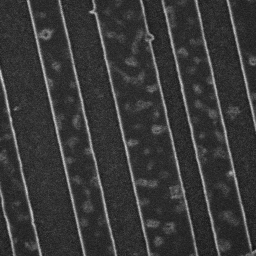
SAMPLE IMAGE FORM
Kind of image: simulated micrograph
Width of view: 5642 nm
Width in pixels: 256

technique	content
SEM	one or a few lines or trenches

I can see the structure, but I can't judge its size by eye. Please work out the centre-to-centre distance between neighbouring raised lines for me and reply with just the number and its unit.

66.6 px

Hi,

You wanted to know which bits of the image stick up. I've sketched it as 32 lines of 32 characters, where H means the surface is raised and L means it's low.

LLLLHHHHLLLLHHHHHHLLHHHHHLLLLHHH
LLLLHHHHLLLLHHHHHHLLLHHHHLLLLHHH
LLLLHHHHLLLLHHHHHHLLLHHHHLLLLHHH
LLLLHHHHLLLLHHHHHHLLLHHHHLLLLHHH
LLLLLHHHLLLLLHHHHHHLLHHHHHLLLHHH
LLLLLHHHHLLLLHHHHHHLLLHHHHLLLLHH
LLLLLHHHHLLLLHHHHHHLLLHHHHLLLLHH
LLLLLHHHHLLLLHHHHHHLLLHHHHLLLLHH
LLLLLHHHHLLLLHHHHHHHLLHHHHLLLLHH
LLLLLLHHHHLLLLHHHHHHLLHHHHHLLLLH
LLLLLLHHHHLLLLHHHHHHLLLHHHHLLLLH
HLLLLLHHHHLLLLHHHHHHLLLHHHHLLLLH
HLLLLLHHHHLLLLHHHHHHLLLHHHHLLLLH
HLLLLLHHHHLLLLLHHHHHHLLHHHHLLLLH
HLLLLLLHHHHLLLLHHHHHHLLLHHHHLLLL
HLLLLLLHHHHLLLLHHHHHHLLLHHHHLLLL
HHLLLLLHHHHLLLLHHHHHHLLLHHHHLLLL
HHLLLLLHHHHLLLLHHHHHHHLLHHHHLLLL
HHLLLLLLHHHLLLLLHHHHHHLLHHHHHLLL
HHLLLLLLHHHHLLLLHHHHHHLLLHHHHLLL
HHHLLLLLHHHHLLLLHHHHHHLLLHHHHLLL
HHHLLLLLHHHHLLLLHHHHHHLLLHHHHLLL
HHHLLLLLHHHHLLLLLHHHHHHLLHHHHLLL
HHHLLLLLLHHHHLLLLHHHHHHLLLHHHHLL
HHHLLLLLLHHHHLLLLHHHHHHLLLHHHHLL
HHHHLLLLLHHHHLLLLHHHHHHLLLHHHHLL
HHHHLLLLLHHHHLLLLHHHHHHHLLHHHHLL
LHHHLLLLLLHHHLLLLLHHHHHHLLHHHHHL
LHHHLLLLLLHHHHLLLLHHHHHHLLLHHHHL
LHHHHLLLLLHHHHLLLLHHHHHHLLLHHHHL
LHHHHLLLLLHHHHLLLLHHHHHHLLLHHHHL
LLHHHLLLLLHHHHLLLLLHHHHHHLLHHHHH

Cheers